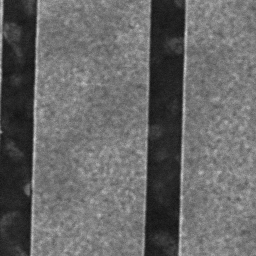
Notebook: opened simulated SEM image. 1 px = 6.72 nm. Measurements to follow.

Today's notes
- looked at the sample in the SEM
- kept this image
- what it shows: one or a few lines or trenches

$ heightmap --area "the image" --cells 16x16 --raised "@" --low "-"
--@@@@@@@---@@@@
--@@@@@@@---@@@@
--@@@@@@@---@@@@
--@@@@@@@---@@@@
--@@@@@@@---@@@@
--@@@@@@@---@@@@
--@@@@@@@---@@@@
--@@@@@@@--@@@@@
--@@@@@@@--@@@@@
--@@@@@@@--@@@@@
--@@@@@@@--@@@@@
--@@@@@@@--@@@@@
--@@@@@@@--@@@@@
--@@@@@@@--@@@@@
--@@@@@@@--@@@@@
--@@@@@@@--@@@@@